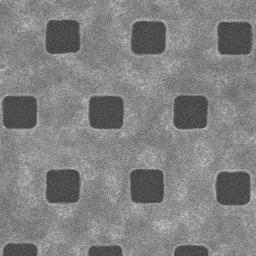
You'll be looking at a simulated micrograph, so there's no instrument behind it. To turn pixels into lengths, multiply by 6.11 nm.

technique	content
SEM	a regular array of holes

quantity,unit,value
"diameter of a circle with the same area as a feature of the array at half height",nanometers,228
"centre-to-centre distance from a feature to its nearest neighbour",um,0.523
